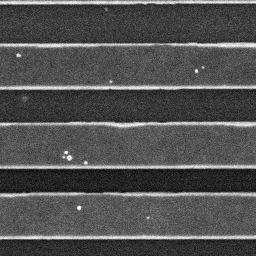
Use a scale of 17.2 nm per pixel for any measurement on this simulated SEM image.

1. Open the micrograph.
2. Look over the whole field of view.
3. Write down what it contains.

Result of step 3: lines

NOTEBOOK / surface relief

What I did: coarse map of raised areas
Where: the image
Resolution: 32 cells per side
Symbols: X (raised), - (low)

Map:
--------------------------------
--------------------------------
--------------------------------
--------------------------------
--------------------------------
--------------------------------
XXXXXXXXXXXXXXXXXXXXXXXXXXXXXXXX
XXXXXXXXXXXXXXXXXXXXXXXXXXXXXXXX
XXXXXXXXXXXXXXXXXXXXXXXXXXXXXXXX
XXXXXXXXXXXXXXXXXXXXXXXXXXXXXXXX
XXXXXXXXXXXXXXXXXXXXXXXXXXXXXXXX
--------------------------------
--------------------------------
--------------------------------
--------------------------------
-XXX--XXXXXXXX---XXXXXXXXXXXXX-X
XXXXXXXXXXXXXXXXXXXXXXXXXXXXXXXX
XXXXXXXXXXXXXXXXXXXXXXXXXXXXXXXX
XXXXXXXXXXXXXXXXXXXXXXXXXXXXXXXX
XXXXXXXXXXXXXXXXXXXXXXXXXXXXXXXX
XXXXXXXXXXXXXXXXXXXXXXXXXXXXXXXX
--------------------------------
--------------------------------
--------------------------------
XXXXXXXXXXXXXXXXXXXXXXXXXXXXXXXX
XXXXXXXXXXXXXXXXXXXXXXXXXXXXXXXX
XXXXXXXXXXXXXXXXXXXXXXXXXXXXXXXX
XXXXXXXXXXXXXXXXXXXXXXXXXXXXXXXX
XXXXXXXXXXXXXXXXXXXXXXXXXXXXXXXX
XXXXXXXXXXXXXXXXXXXXXXXXXXXXXXXX
--------------------------------
--------------------------------